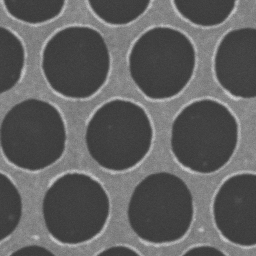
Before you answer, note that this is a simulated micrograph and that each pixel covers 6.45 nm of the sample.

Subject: holes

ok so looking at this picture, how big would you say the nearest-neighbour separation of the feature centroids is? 544 nm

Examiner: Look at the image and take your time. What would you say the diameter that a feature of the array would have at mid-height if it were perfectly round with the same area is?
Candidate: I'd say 443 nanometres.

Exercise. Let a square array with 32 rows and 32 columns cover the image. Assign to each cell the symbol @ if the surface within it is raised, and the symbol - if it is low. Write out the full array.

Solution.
@-------@@@--------@@@-------@@@
@------@@@@@------@@@@-------@@@
@@----@@@@@@@----@@@@@@@----@@@@
-@@@@@@@---@@@@@@@@--@@@@@@@@@--
--@@@@@------@@@@@-----@@@@@----
---@@@-------@@@@-------@@@-----
---@@---------@@--------@@@-----
---@@---------@@--------@@@-----
---@@---------@@--------@@@-----
---@@@-------@@@--------@@@-----
--@@@@-------@@@@------@@@@@----
-@@@@@@-----@@@@@@----@@@@@@@---
@@@--@@@@@@@@@-@@@@@@@@@@@@@@@@@
@------@@@@@@-----@@@@@-----@@@@
@-------@@@@------@@@@-------@@@
--------@@@--------@@@--------@@
--------@@@--------@@---------@@
--------@@@--------@@---------@@
--------@@@--------@@--------@@@
@-------@@@-------@@@@-------@@@
@@-----@@@@@-----@@@@@@-----@@@@
@@@@@@@@@@@@@@@@@@@@-@@@@--@@@@@
-@@@@@@-----@@@@@@-----@@@@@----
--@@@@-------@@@@-------@@@@----
---@@@-------@@@--------@@@-----
---@@---------@@--------@@@-----
---@@---------@@--------@@@-----
---@@--------@@@--------@@@-----
--@@@@-------@@@--------@@@-----
-@@@@@@-----@@@@@------@@@@@----
@@@@@@@@@@@@@@@@@@@@@@@@@@@@@@--
@@----@@@@@@@----@@@@@@-----@@@@